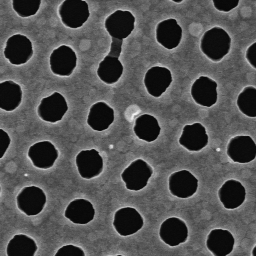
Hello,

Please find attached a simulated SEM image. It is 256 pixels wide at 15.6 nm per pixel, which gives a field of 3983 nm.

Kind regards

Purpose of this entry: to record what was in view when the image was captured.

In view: a regular array of holes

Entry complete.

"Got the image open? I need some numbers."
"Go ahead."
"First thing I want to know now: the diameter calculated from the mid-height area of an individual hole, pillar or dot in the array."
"434 nanometres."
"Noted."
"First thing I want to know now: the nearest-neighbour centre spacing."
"732 nm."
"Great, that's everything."